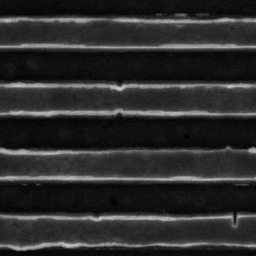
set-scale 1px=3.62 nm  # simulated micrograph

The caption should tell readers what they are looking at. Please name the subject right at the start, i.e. one or a few lines or trenches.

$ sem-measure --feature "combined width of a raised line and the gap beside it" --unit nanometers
239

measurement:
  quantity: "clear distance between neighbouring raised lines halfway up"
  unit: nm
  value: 135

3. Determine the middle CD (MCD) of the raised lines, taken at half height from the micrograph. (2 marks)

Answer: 106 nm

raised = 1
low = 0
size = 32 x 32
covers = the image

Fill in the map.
00000000000000000000000000000000
00000000000000000000000000000000
11111111111111111100111100111111
11111111111111111111111111111111
11111111111111111111111111111111
11111111111111111111111111111111
00000000000000000000000000000000
00000000000000000000000000000000
00000000000000000000000000000000
00000000000000000000000000000000
01111100000000000000000000000010
11111111111111111111111111111111
11111111111111111111111111111111
11111111111111111111111111111111
00000100000000000000000000000000
00000000000000000000000000000000
00000000000000000000000000000000
00000000000000000000000000000000
00000000000000000000000000000001
11111111111111111111111111111111
11111111111111111111111111111111
11111111111111111111111111111111
01000000000000000000000000000000
00000000000000000000000000000000
00000000000000000000000000000000
00000000000000000000000000000000
00000000000000000000000000000000
11111111111111111111111111111111
11111111111111111111111111111111
11111111111111111111111111111111
11111111111111111111011100110111
00000000000000000000000000000000